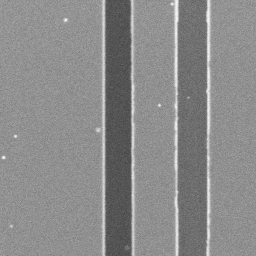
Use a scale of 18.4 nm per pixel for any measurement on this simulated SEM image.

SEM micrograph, lines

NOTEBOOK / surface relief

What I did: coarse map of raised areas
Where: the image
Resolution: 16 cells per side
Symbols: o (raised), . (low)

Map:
oooooo..ooo..ooo
oooooo..ooo..ooo
oooooo..ooo..ooo
ooooooo.ooo..ooo
oooooo..ooo..ooo
oooooo..ooo..ooo
oooooo..ooo..ooo
oooooo..ooo..ooo
oooooo..ooo..ooo
oooooo..ooo..ooo
oooooo..ooo..ooo
oooooo..ooo..ooo
oooooo..ooo..ooo
oooooo..ooo..ooo
oooooo..ooo..ooo
oooooo..ooo..ooo